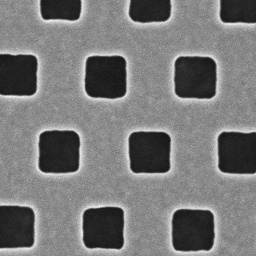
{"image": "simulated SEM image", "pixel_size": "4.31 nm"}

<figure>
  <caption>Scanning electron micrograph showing holes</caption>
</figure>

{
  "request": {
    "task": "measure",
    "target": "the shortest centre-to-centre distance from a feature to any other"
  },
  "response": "0.377 µm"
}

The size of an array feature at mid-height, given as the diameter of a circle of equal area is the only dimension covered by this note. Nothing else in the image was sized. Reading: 199 nanometers